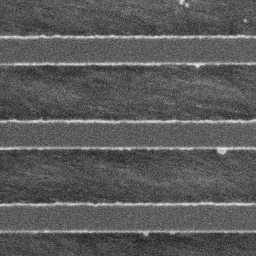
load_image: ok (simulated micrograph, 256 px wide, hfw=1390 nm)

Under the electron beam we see lines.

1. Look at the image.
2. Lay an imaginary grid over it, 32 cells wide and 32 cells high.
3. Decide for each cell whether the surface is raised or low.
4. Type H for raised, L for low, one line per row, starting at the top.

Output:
LLLLLLLLLLLLLLLLLLLLLLLLLLLLLLLL
LLLLLLLLLLLLLLLLLLLLLLLLLLLLLLLL
LLLLLLLLLLLLLLLLLLLLLLLLLLLLLLLL
LLLLLLLLLLLLLLLLLLLLLLLLLLLLLLLL
LLLLLHLLLLLLHHHLLLLLLLLLLLLHLHHL
HHHHHHHHHHHHHHHHHHHHHHHHHHHHHHHH
HHHHHHHHHHHHHHHHHHHHHHHHHHHHHHHH
HHHHHHHHHHHHHHHHHHHHHHHHHHHHHHHH
LLLLLLLLLLLLLLLLLLLLLLLLLLLLLLLL
LLLLLLLLLLLLLLLLLLLLLLLLLLLLLLLL
LLLLLLLLLLLLLLLLLLLLLLLLLLLLLLLL
LLLLLLLLLLLLLLLLLLLLLLLLLLLLLLLL
LLLLLLLLLLLLLLLLLLLLLLLLLLLLLLLL
LLLLLLLLLLLLLLLLLLLLLLLLLLLLLLLL
LLLLLLLLLLLLLLLLLLLLLLLLLLLLLLLL
HHHHHHHHHHHHHHHHHHHHHHHHHHHHHHHH
HHHHHHHHHHHHHHHHHHHHHHHHHHHHHHHH
HHHHHHHHHHHHHHHHHHHHHHHHHHHHHHHH
HHHHHHHHHHHHHHHHHHHHHHHHHHHHHHHH
LLLLLLLLLLLLLLLLLLLLLLLLLLLLLLLL
LLLLLLLLLLLLLLLLLLLLLLLLLLLLLLLL
LLLLLLLLLLLLLLLLLLLLLLLLLLLLLLLL
LLLLLLLLLLLLLLLLLLLLLLLLLLLLLLLL
LLLLLLLLLLLLLLLLLLLLLLLLLLLLLLLL
LLLLLLLLLLLLLLLLLLLLLLLLLLLLLLLL
LHHHHLHHHHHHHHHHHHHHHHHHHHHHHHHH
HHHHHHHHHHHHHHHHHHHHHHHHHHHHHHHH
HHHHHHHHHHHHHHHHHHHHHHHHHHHHHHHH
HHHHHHHHHHHHHHHHHHHHHHHHHHHHHHHH
LLLLLLLLLLLLLLLLLLLLLLLLLLLLLLLL
LLLLLLLLLLLLLLLLLLLLLLLLLLLLLLLL
LLLLLLLLLLLLLLLLLLLLLLLLLLLLLLLL